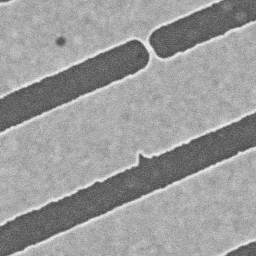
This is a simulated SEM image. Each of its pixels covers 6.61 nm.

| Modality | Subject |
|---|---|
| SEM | one or a few lines or trenches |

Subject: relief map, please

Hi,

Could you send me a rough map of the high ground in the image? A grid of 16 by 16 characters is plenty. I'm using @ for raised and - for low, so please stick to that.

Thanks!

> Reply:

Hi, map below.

@@@@@@@@@@@@@---
@@@@@@@@@@-----@
@@@@@@@@@----@@@
@@@@@@-----@@@@@
@@@@-----@@@@@@@
@-----@@@@@@@@@@
----@@@@@@@@@@@@
--@@@@@@@@@@@@@-
@@@@@@@@@@@@@---
@@@@@@@@@@-----@
@@@@@@@@-----@@@
@@@@@@-----@@@@@
@@@@-----@@@@@@@
@-----@@@@@@@@@@
----@@@@@@@@@@@@
--@@@@@@@@@@@@@-